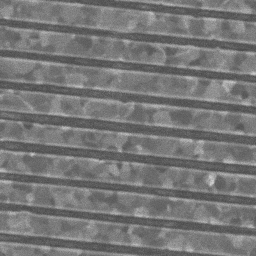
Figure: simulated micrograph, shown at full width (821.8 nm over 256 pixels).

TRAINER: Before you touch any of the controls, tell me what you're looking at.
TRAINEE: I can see parallel lines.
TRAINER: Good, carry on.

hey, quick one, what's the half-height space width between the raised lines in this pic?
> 34.3 nm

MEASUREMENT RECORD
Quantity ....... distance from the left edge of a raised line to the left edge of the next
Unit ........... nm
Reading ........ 97.7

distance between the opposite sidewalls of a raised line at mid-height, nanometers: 65.4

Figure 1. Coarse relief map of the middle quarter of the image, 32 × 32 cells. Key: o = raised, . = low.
oo...........................ooo
oooooooooooo....................
oooooooooooooooooooo............
ooooooooooooooooooooooooooooooo.
oooooooooooooooooooooooooooooooo
.ooooooooooooooooooooooooooooooo
.............ooooooooooooooooooo
.......................ooooooooo
ooooo..........................o
oooooooooooooo..................
oooooooooooooooooooooooo........
oooooooooooooooooooooooooooooooo
oooooooooooooooooooooooooooooooo
........oooooooooooooooooooooooo
.................ooooooooooooooo
...........................ooooo
oooooo..........................
oooooooooooooo..................
oooooooooooooooooooooooooo......
oooooooooooooooooooooooooooooooo
..oooooooooooooooooooooooooooooo
............oooooooooooooooooooo
......................oooooooooo
ooo...........................oo
ooooooooooooo...................
ooooooooooooooooooooooo.........
ooooooooooooooooooooooooooooooo.
oooooooooooooooooooooooooooooooo
.ooooooooooooooooooooooooooooooo
.............ooooooooooooooooooo
.......................ooooooooo
ooooooo.........................